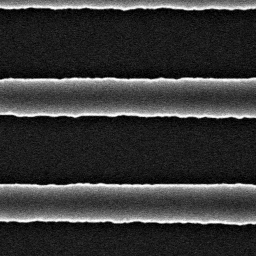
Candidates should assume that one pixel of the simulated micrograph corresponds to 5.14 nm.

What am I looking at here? lines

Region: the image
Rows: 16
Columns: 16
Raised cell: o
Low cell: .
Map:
o..o..oooo.ooooo
................
................
................
................
oooooooooooooooo
oooooooooooooooo
................
................
................
................
.....oo.........
oooooooooooooooo
oooooooooooooooo
................
................